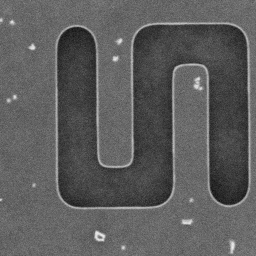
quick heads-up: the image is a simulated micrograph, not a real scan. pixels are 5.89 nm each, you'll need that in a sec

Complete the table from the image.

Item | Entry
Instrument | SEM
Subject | groups of lines, slits or small figures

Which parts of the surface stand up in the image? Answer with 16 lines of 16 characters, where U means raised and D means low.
UUUUUUUUUUUUUUUU
UUUUUUUUUUDDDDUU
UUUUDDUUDDDDDDDU
UUUUDDUUDDDDDDDD
UUUDDDUUDDDUUDDD
UUUUDDUUDDDUUDDD
UUUUDDUUDDDUUDDD
UUUUDDUUDDDUUDDD
UUUUDDUUDDDUUDDD
UUUUDDUUDDDUUDDD
UUUUDDDDDDDUUDDD
UUUUDDDDDDDUUDDD
UUUUDDDDDDUUUUDU
UUUUUUUUUUUUUUUU
UUUUUUUUUUUUUUUU
UUUUUUUUUUUUUUUU